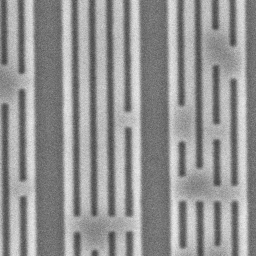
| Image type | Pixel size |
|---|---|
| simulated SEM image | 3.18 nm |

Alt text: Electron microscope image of groups of lines, slits or small figures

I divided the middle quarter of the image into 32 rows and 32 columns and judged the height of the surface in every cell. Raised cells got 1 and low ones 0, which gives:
11001100111001100110000000110011
11001100111001100110000000110011
11001100111001100110000000110011
11001100111001100110000000110011
11001100111001100110000000010011
11001100111001100110000000010011
11001100111001100110000000010011
11001100111001100110000000010011
11001100111001100110000000010011
11001100111001100110000000010011
11001100111001100110000000011011
11001100111001100110000000011111
11001100111001111110000000011111
11001100111001111110000000011111
11001100111001111110000000011111
11001100111001111110000000011111
11001100111001100110000000011111
11001100111001100110000000011111
11001100111001100110000000011111
11001100111001100110000000011011
11001100011001100110000000010001
11001100111001100110000000011001
11001110111001100110000000011001
11001110111001100110000000011001
11001110011001100110000000011001
11001110011001100110000000011001
11001110011001100110000000010001
11001110011001100110000000010001
11001110011001100110000000011111
11001100011001100110000000011111
11001100011001100110000000011111
11001100011001100110000000011111